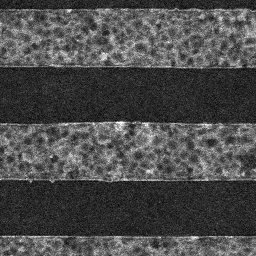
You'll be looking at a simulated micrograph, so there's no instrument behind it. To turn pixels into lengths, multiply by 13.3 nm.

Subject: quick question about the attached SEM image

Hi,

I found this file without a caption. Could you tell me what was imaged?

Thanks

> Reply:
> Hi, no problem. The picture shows one or a few lines or trenches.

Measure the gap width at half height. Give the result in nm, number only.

750